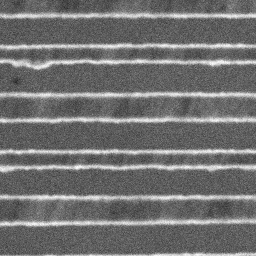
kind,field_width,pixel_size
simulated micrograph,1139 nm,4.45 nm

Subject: lines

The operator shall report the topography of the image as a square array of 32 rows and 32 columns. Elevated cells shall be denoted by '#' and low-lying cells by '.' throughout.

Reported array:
################################
################################
................................
................................
................................
................................
################################
################################
....#...........................
................................
................................
................................
################################
################################
################################
................................
................................
................................
................................
################################
################################
................................
................................
................................
................................
################################
################################
################################
................................
................................
................................
................................